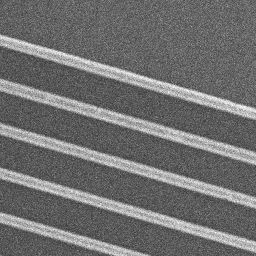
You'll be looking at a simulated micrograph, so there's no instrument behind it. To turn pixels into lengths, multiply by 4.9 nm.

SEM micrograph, parallel lines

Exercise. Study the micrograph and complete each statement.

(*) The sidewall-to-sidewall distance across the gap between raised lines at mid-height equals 169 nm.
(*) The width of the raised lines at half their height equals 40.6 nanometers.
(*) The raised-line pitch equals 208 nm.